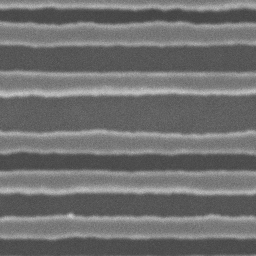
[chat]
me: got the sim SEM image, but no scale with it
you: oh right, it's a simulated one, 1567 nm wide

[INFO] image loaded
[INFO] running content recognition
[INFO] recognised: lines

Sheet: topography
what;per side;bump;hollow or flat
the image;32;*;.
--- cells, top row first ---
********************************
................................
................................
********************************
********************************
********************************
................................
................................
................................
********************************
********************************
********************************
................................
................................
................................
................................
..........*****................*
********************************
********************************
................................
................................
.*************......***...******
********************************
********************************
................................
................................
................................
********************************
********************************
********************************
................................
................................